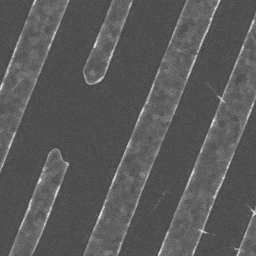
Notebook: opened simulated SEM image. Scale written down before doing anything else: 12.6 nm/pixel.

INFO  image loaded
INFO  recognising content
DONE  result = one or a few lines or trenches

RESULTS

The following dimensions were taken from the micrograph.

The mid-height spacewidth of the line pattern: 0.494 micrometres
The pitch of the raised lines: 892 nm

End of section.